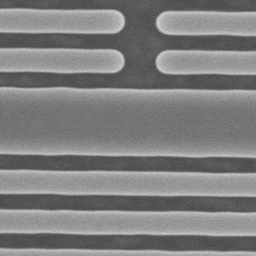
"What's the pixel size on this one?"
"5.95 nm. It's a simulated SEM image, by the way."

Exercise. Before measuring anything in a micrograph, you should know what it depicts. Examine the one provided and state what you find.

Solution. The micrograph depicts groups of lines, slits or small figures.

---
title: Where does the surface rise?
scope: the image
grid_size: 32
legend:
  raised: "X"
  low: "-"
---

--------------------------------
XXXXXXXXXXXXXXX------XXXX-------
XXXXXXXXXXXXXXX-----XXXXXXXXXXXX
XXXXXXXXXXXXXXX-----XXXXXXXXXXXX
--------------------------------
--------------------------------
XXXXXXXXXXXXXXX-----XXXXXXXXXX-X
XXXXXXXXXXXXXXX-----XXXXXXXXXXXX
XXXXXXXXXXXXXXX-----XXXXXXXXXXXX
--------------------------------
--------------------------------
XXXXXXXXXXXXXXXXXXXXXXXXXXXXXXXX
XXXXXXXXXXXXXXXXXXXXXXXXXXXXXXXX
XXXXXXXXXXXXXXXXXXXXXXXXXXXXXXXX
XXXXXXXXXXXXXXXXXXXXXXXXXXXXXXXX
XXXXXXXXXXXXXXXXXXXXXXXXXXXXXXXX
XXXXXXXXXXXXXXXXXXXXXXXXXXXXXXXX
XXXXXXXXXXXXXXXXXXXXXXXXXXXXXXXX
XXXXXXXXXXXXXXXXXXXXXXXXXXXXXXXX
----------------------XXXXXXXXXX
--------------------------------
XXXXXXXXXXXXXX------------------
XXXXXXXXXXXXXXXXXXXXXXXXXXXXXXXX
XXXXXXXXXXXXXXXXXXXXXXXXXXXXXXXX
---------------------------XXXXX
--------------------------------
XXXXXXXXXXXXXXXX----------------
XXXXXXXXXXXXXXXXXXXXXXXXXXXXXXXX
XXXXXXXXXXXXXXXXXXXXXXXXXXXXXXXX
--------------------------------
--------------------------------
XXXXXXXXXXXXXXXXXXXXXXXXXXX-----